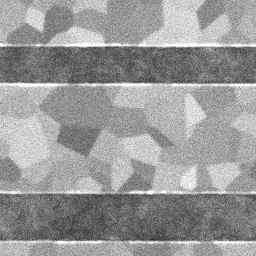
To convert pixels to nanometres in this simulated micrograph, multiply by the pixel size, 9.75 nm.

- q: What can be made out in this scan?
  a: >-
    one or a few lines or trenches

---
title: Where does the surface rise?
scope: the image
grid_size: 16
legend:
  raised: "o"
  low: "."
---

oooooooooooooooo
oooooooooooooooo
oooooooooooooooo
................
................
oooooooooooooooo
oooooooooooooooo
oooooooooooooooo
oooooooooooooooo
oooooooooooooooo
oooooooooooooooo
oooooooooooooooo
................
................
................
oooooooooooooooo